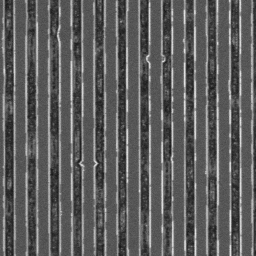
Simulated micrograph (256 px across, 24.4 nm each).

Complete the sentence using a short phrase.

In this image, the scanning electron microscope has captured parallel lines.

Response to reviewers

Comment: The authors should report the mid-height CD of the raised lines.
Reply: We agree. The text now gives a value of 323 nm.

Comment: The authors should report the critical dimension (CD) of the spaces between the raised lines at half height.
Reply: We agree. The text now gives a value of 232 nm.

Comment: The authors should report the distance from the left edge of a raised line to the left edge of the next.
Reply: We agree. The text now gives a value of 550 nanometers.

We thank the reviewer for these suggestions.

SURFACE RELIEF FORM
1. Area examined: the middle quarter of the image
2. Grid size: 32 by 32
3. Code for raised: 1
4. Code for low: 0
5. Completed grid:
11000110001110001110011100011100
11000110001110001110011100011100
11000110001110001110011100011100
11000110001110001110011100011100
11000110001110001110011100011100
11000110001110001110011100011100
11000110001110001110011100011100
11000110001110001110011100011100
11000110001110001110011100011100
11000110001110001110011100011100
11000110001110001110011110011100
11000111001110001110011110011100
11000111001110001110011110011100
11000111001110001110011110011100
11000111001110001110011110011100
11000111001110001110011110011100
11000111001110001110011110011100
11000111001110001110011110011100
11000111001110001110011110011100
11000111001110001110011110011100
11000111001110001110011110011100
11000111001110001110011110011100
11000111001110001110011110011100
11000111001110001110011110011100
11001111001110001110011110011100
11001111001110001110011110011100
11000111001110001110011110011100
11000111001110001110011110011100
11000111001110001110011110011100
11000111001110001110011110011100
11000111001110001110011110011100
11000111001110001110011110011100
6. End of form